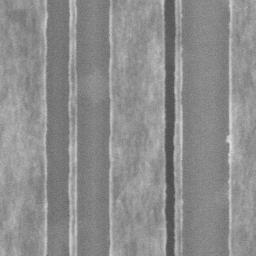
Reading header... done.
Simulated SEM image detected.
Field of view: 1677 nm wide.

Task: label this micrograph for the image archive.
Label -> lines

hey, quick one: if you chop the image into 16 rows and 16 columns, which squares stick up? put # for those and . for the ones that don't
###....###....##
###....###....##
###....###....##
###....###....##
###....###....##
###....###....##
###....###....##
###....###....##
###....###....##
###....###....##
###....###....##
###....###....##
###....###....##
###....###....##
###....###....##
###....###....##